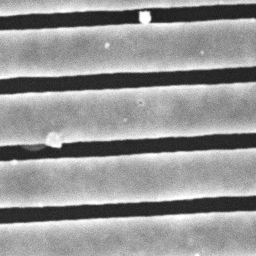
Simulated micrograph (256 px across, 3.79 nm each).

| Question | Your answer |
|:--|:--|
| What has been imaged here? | lines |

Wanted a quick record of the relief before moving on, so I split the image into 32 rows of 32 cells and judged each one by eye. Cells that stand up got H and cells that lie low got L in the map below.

HHHHHHHHHHHHHHHHHHHHHHHHHHHLLLLL
HHHHHHHHHHLLLLLLLLLLLLLLLLLLLLLL
LLLLLLLLLLLLLLLLLHHLLLLLLLLLLHHH
LLLLLLLLLHHHHHHHHHHHHHHHHHHHHHHH
HHHHHHHHHHHHHHHHHHHHHHHHHHHHHHHH
HHHHHHHHHHHHHHHHHHHHHHHHHHHHHHHH
HHHHHHHHHHHHHHHHHHHHHHHHHHHHHHHH
HHHHHHHHHHHHHHHHHHHHHHHHHHHHHHHH
HHHHHHHHHHHHHHHHHHHHHHHHHHHHHLLL
HHHHHHHHLLLLLLLLLLLLLLLLLLLLLLLL
LLLLLLLLLLLLLLLLLLLLLLLLLLLLLHHH
LLLLLLLLHHHHHHHHHHHHHHHHHHHHHHHH
HHHHHHHHHHHHHHHHHHHHHHHHHHHHHHHH
HHHHHHHHHHHHHHHHHHHHHHHHHHHHHHHH
HHHHHHHHHHHHHHHHHHHHHHHHHHHHHHHH
HHHHHHHHHHHHHHHHHHHHHHHHHHHHHHHH
HHHHHHHHHHHHHHHHHHHHHHHHHHHHHHHH
HHHHHHHHHHHHHHHLLLLLLLLLLLLLLLLL
LLLLLLLLLLLLLLLLLLLLLLLLLLLLLLLL
LLLLLLLLLLLLLLLHHHHHHHHHHHHHHHHH
HHHHHHHHHHHHHHHHHHHHHHHHHHHHHHHH
HHHHHHHHHHHHHHHHHHHHHHHHHHHHHHHH
HHHHHHHHHHHHHHHHHHHHHHHHHHHHHHHH
HHHHHHHHHHHHHHHHHHHHHHHHHHHHHHHH
HHHHHHHHHHHHHHHHHHHHHHHHHHHHLLLL
HHHHHHHHHHHLLLLLLLLLLLLLLLLLLLLL
LLLLLLLLLLLLLLLLLLLLLLLLLLLLLHHH
LLLLLLLLLHHHHHHHHHHHHHHHHHHHHHHH
HHHHHHHHHHHHHHHHHHHHHHHHHHHHHHHH
HHHHHHHHHHHHHHHHHHHHHHHHHHHHHHHH
HHHHHHHHHHHHHHHHHHHHHHHHHHHHHHHH
HHHHHHHHHHHHHHHHHHHHHHHHHHHHHHHH